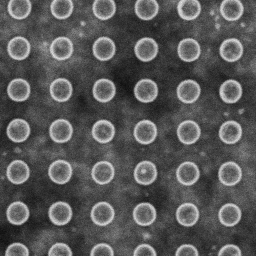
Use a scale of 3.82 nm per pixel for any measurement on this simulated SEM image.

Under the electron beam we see a regular array of raised bodies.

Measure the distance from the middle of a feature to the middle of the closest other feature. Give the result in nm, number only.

157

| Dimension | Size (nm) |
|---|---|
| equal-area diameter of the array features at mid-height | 83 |